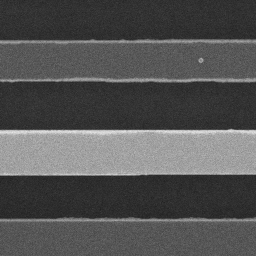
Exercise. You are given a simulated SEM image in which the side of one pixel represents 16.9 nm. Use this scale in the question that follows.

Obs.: lines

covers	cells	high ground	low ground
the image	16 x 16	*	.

................
................
................
****************
****************
................
................
................
****************
****************
****************
................
................
................
****************
****************